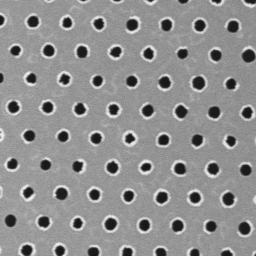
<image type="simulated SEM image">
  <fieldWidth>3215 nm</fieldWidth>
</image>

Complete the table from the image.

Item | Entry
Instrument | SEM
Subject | a regular array of holes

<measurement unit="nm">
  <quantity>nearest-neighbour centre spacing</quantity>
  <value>407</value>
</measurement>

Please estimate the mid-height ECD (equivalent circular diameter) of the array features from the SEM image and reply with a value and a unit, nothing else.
11.5 pixels